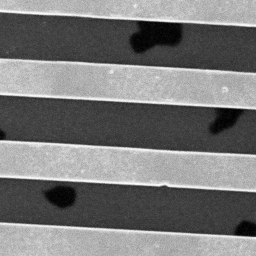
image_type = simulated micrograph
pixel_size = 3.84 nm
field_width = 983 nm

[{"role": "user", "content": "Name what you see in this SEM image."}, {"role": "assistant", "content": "one or a few lines or trenches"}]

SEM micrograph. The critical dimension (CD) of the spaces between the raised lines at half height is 180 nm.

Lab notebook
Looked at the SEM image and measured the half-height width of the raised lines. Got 136 nanometers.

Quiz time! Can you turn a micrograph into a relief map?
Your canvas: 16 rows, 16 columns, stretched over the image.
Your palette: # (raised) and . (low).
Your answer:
################
..............##
................
................
###############.
################
...........#####
................
................
############....
################
........########
................
................
##########......
################